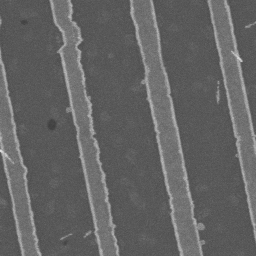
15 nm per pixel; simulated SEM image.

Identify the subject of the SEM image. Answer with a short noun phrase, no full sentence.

one or a few lines or trenches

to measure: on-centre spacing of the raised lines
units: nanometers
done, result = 1170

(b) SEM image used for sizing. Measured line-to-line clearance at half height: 892 nm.